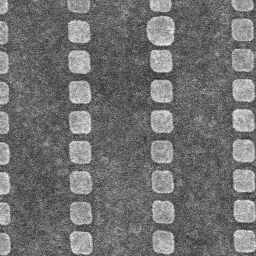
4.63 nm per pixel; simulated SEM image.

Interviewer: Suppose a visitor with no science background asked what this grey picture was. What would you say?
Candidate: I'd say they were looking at a regular array of raised bodies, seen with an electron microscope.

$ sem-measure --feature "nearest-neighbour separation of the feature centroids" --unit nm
139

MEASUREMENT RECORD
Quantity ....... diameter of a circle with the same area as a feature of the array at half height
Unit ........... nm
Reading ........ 108